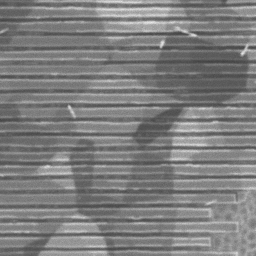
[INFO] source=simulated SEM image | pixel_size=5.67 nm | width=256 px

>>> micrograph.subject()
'parallel lines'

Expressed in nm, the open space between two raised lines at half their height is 24.8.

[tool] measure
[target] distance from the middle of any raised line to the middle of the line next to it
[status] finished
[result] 81.3 nm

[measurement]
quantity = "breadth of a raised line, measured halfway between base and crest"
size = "9.38 px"